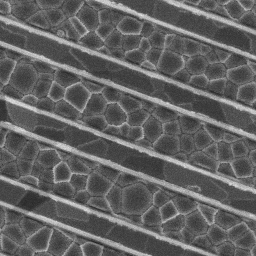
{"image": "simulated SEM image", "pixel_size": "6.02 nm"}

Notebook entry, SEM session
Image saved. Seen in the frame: one or a few lines or trenches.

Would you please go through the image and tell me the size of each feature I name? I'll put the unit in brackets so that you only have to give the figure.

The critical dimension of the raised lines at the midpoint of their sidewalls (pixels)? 25.4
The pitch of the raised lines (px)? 74.7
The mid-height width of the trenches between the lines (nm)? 294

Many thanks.